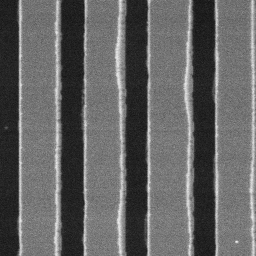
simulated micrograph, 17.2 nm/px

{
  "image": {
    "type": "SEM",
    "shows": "lines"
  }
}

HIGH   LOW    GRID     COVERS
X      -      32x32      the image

--XXXXX----XXXX----XXXXX---XXXXX
--XXXXX----XXXX----XXXXX---XXXXX
--XXXXX----XXXX----XXXXX---XXXXX
--XXXXX----XXXX----XXXXX---XXXXX
--XXXXX----XXXX----XXXXX---XXXXX
--XXXXX----XXXX----XXXXX---XXXXX
--XXXXX----XXXX----XXXXX---XXXXX
--XXXXX----XXXX----XXXXX---XXXXX
--XXXXX----XXXX----XXXXX---XXXXX
--XXXXX----XXXX----XXXXX---XXXXX
--XXXXX----XXXX----XXXXX---XXXXX
--XXXXX----XXXX----XXXXX---XXXXX
--XXXXX----XXXX----XXXXX---XXXXX
--XXXXX----XXXX----XXXXX---XXXXX
--XXXXX----XXXX----XXXXX---XXXXX
--XXXXX----XXXX----XXXXX---XXXXX
--XXXXX----XXXX----XXXXX---XXXXX
--XXXXX----XXXX----XXXXX---XXXXX
--XXXXX----XXXX----XXXXX---XXXXX
--XXXXX----XXXX----XXXXX---XXXXX
--XXXXX----XXXX----XXXXX---XXXXX
--XXXXX----XXXX----XXXXX---XXXXX
--XXXXX----XXXX----XXXXX---XXXXX
--XXXXX----XXXX----XXXXX---XXXXX
--XXXXX----XXXX----XXXXX---XXXXX
--XXXXX----XXXX----XXXXX---XXXXX
--XXXXX----XXXX----XXXXX---XXXXX
--XXXXX----XXXX----XXXXX---XXXXX
--XXXXX----XXXX----XXXXX---XXXXX
--XXXXX----XXXX----XXXXX---XXXXX
--XXXXX----XXXX----XXXXX---XXXXX
--XXXXX----XXXX----XXXXX---XXXXX